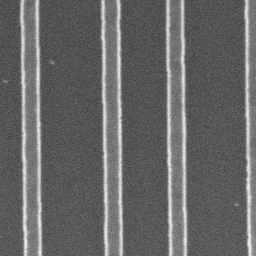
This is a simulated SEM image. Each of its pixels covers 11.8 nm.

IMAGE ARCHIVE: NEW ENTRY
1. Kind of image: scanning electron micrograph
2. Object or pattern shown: lines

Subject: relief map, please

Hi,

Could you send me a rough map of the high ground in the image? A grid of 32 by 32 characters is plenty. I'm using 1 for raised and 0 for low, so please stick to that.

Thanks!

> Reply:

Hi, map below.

00011000000001100000011000000001
00011000000001100000011000000001
00011000000001100000011000000001
00011000000001100000011000000001
00011000000001100000011000000001
00011000000001100000011000000001
00011000000001100000011000000001
00011000000001100000011000000001
00011000000001100000011000000001
00011000000001100000011000000001
00011000000001100000011000000001
00011000000001100000011000000001
00011000000001100000011000000001
00011000000001100000011000000001
00011000000001100000011000000001
00011000000001100000011000000001
00011000000001100000011000000001
00011000000001100000011000000001
00011000000001100000011000000001
00011000000001100000011000000001
00011000000001100000011000000001
00011000000001100000011000000001
00011000000001100000011000000001
00011000000001100000011000000001
00011000000001100000011000000001
00011000000001100000011000000001
00011000000001100000011000000001
00011000000001100000011000000001
00011000000001100000011000000001
00011000000001100000011000000001
00011000000001100000011000000001
00011000000001100000011000000001